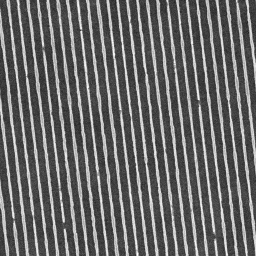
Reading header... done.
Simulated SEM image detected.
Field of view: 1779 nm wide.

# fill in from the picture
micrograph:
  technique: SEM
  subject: parallel lines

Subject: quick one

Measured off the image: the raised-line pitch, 68.7 nm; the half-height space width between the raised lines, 54.3 nanometres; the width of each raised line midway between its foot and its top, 16.4 nm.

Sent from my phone